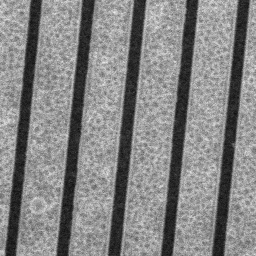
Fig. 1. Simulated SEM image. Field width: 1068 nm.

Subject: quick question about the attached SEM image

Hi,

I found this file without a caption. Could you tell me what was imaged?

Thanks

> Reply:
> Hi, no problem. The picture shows parallel lines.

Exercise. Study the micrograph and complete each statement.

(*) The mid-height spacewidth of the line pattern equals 55.9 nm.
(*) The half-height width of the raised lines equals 0.16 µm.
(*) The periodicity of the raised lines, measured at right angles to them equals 215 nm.